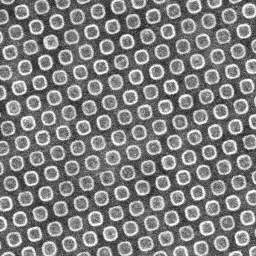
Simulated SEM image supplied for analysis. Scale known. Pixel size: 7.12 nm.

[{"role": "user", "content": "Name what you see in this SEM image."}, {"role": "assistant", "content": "a regular array of raised bodies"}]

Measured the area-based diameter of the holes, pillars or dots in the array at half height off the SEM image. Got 14.1 px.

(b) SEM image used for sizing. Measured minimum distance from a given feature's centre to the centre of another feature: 148 nanometres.